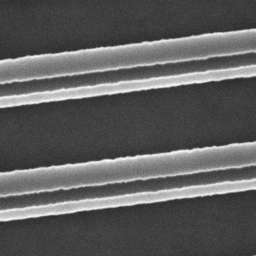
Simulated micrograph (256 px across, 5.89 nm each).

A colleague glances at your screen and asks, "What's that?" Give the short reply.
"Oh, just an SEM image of lines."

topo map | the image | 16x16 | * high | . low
................
................
...........*****
..**************
****************
**********......
**..............
................
................
...........*****
...*************
****************
**********......
***.............
................
................